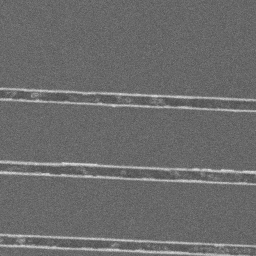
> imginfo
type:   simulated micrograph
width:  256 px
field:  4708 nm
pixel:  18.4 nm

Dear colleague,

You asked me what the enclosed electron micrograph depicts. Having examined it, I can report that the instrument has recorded one or a few lines or trenches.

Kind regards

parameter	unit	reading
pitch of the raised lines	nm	1340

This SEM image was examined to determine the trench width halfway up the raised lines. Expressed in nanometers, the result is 1130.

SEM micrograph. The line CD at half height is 198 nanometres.